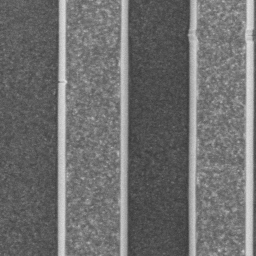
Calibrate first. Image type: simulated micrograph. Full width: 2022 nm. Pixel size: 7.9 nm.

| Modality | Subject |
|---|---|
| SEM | one or a few lines or trenches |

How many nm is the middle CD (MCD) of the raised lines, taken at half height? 485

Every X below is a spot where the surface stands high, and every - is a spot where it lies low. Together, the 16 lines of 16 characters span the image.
----XXXX----XXXX
----XXXX----XXXX
----XXXX----XXXX
----XXXX----XXXX
----XXXX----XXXX
----XXXX----XXXX
----XXXX----XXXX
----XXXX----XXXX
----XXXX----XXXX
----XXXX----XXXX
----XXXX----XXXX
----XXXX----XXXX
----XXXX----XXXX
----XXXX----XXXX
----XXXX----XXXX
----XXXX----XXXX